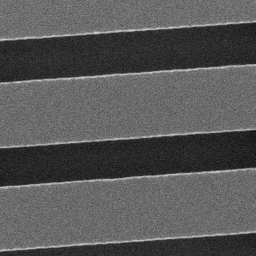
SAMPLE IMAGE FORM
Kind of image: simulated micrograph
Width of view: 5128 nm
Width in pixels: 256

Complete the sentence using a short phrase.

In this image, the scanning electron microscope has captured lines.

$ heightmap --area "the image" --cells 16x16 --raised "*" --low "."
****************
**************..
................
................
.........*******
****************
****************
****************
**********......
................
................
..**************
****************
****************
****************
**..............